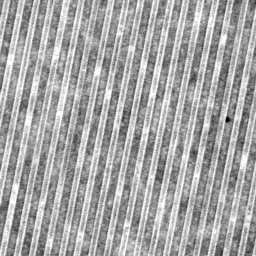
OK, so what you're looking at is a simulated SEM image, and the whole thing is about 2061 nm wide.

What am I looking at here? parallel lines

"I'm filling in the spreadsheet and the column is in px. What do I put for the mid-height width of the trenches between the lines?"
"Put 9.2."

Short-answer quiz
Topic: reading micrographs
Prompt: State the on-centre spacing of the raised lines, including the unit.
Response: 118 nanometres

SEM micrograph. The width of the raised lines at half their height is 40.5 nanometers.